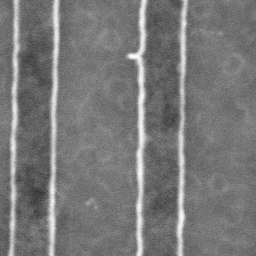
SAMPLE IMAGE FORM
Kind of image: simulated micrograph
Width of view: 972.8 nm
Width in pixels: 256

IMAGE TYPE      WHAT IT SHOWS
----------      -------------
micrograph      one or a few lines or trenches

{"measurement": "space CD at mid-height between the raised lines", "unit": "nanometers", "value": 325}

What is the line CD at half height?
41.8 pixels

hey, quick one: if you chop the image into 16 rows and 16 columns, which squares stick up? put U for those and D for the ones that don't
DUUUDDDDDUUUDDDD
DUUUDDDDDUUUDDDD
DUUUDDDDDUUDDDDD
DUUDDDDDDUUDDDDD
DUUDDDDDDUUDDDDD
DUUDDDDDDUUDDDDD
DUUDDDDDDUUDDDDD
DUUDDDDDDUUDDDDD
DUUDDDDDDUUDDDDD
DUUDDDDDDUUDDDDD
DUUDDDDDDUUDDDDD
DUUDDDDDDUUDDDDD
DUUDDDDDDUUDDDDD
DUUDDDDDDUUDDDDD
DUUDDDDDDUUDDDDD
DUUDDDDDDUUDDDDD